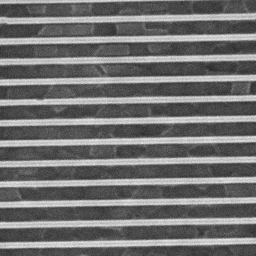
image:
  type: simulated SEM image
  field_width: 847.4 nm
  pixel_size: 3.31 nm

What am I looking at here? parallel lines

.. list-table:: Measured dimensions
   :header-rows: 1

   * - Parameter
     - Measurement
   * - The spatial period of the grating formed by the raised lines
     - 67.6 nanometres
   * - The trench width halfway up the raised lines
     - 51.3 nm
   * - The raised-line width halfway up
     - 17.8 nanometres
